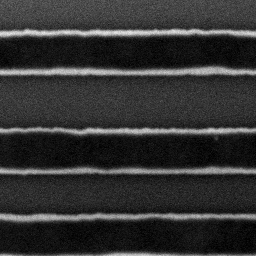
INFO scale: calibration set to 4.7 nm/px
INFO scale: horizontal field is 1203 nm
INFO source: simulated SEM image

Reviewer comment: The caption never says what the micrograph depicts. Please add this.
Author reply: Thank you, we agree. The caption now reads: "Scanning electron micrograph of lines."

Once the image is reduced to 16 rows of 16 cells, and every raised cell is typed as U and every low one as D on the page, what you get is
DDDDDDDDDDDDDDDD
DDDDDDDDDDDDDDDD
UUUUUUUUUUUUUUUU
UUUUUUUUUUUUUUUU
UUUUUUUUUUUUUDUU
DDDDDDDDDDDDDDDD
DDDDDDDDDDDDDDDD
DDDDDDDDDDDDDDDD
UUUUUUUUUUUUUUUU
UUUUUUUUUUUUUUUU
UUUUUUUUUUUUUUUU
DDDDDDDDDDDDDDDD
DDDDDDDDDDDDDDDD
DDDDDDUUUUUUUUUU
UUUUUUUUUUUUUUUU
UUUUUUUUUUUUUUUU